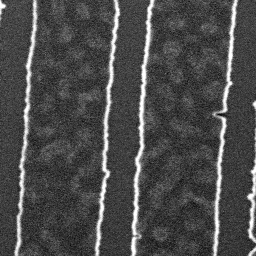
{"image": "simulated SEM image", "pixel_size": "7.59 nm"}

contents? one or a few lines or trenches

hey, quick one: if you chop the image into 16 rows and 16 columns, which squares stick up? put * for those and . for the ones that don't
..*****..******.
..*****..******.
..*****..*****..
..*****..*****..
..*****..*****..
..*****..*****..
..*****..*****..
..*****..*****..
..*****..*****..
.******..*****..
.******..*****..
.******.******..
.*****..******..
.*****..******..
.*****..******..
.*****..*****...